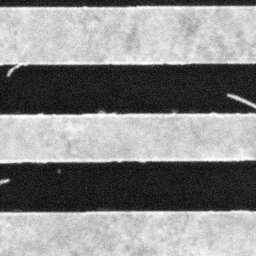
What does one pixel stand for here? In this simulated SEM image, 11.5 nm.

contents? lines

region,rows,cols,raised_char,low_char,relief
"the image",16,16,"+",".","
........++++++++
++++++++++++++++
++++++++++++++++
++++++++++++++++
................
................
................
++++++++++++++++
++++++++++++++++
++++++++++++++++
................
................
................
++++++++++++++++
++++++++++++++++
++++++++++++++++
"